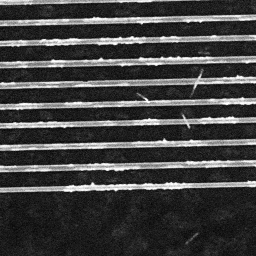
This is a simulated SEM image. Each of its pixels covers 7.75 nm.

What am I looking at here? parallel lines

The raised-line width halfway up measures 46.5 nm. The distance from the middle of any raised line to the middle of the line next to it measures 161 nanometers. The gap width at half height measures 119 nm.